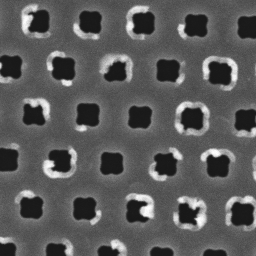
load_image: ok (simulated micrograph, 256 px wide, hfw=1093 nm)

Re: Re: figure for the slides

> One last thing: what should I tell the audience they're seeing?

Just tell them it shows a regular array of holes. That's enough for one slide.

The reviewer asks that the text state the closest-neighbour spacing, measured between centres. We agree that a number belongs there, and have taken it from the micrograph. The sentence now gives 51.9 px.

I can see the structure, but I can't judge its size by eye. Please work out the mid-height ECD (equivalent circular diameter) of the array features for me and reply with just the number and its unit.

102 nanometers